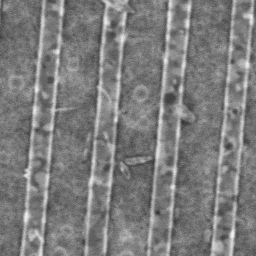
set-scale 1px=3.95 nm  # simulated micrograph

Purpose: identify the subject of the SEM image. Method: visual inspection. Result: one or a few lines or trenches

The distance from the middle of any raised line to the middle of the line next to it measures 63.1 pixels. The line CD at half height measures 76.1 nanometres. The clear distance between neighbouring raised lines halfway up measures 0.172 µm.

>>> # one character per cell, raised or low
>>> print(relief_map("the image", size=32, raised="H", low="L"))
LLLLLHHHLLLLLHHHLLLLLHHHLLLLLHHH
LLLLLHHHLLLLLHHHLLLLLHHHLLLLLHHL
LLLLLHHHLLLLLHHHLLLLLHHHLLLLLHHL
LLLLLHHHLLLLLHHLLLLLLHHHLLLLLHHL
LLLLLHHHLLLLLHHLLLLLLHHLLLLLLHHL
LLLLLHHLLLLLLHHLLLLLLHHLLLLLLHHL
LLLLLHHLLLLLLHHLLLLLLHHLLLLLLHHL
LLLLLHHLLLLLLHHLLLLLLHHLLLLLLHHL
LLLLLHHLLLLLLHHLLLLLLHHLLLLLLHHL
LLLLLHHLLLLLLHHLLLLLLHHLLLLLLHHL
LLLLLHHLLLLLHHHLLLLLHHHLLLLLHHHL
LLLLLHHLLLLLHHHLLLLLHHHLLLLLHHHL
LLLLHHHLLLLLHHHLLLLLHHHLLLLLHHHL
LLLLHHHLLLLLHHHLLLLLHHHLLLLLHHLL
LLLLHHHLLLLLHHHLLLLLHHHHLLLLHHLL
LLLLHHHLLLLLHHLLLLLLHHLLLLLLHHLL
LLLLHHLLLLLLHHLLLLLLHHLLLLLLHHLL
LLLLHHLLLLLLHHLLLLLLHHLLLLLLHHLL
LLLLHHLLLLLLHHLLLLLLHHLLLLLLHHLL
LLLLHHLLLLLLHHLLLLLLHHLLLLLLHHLL
LLLLHHLLLLLLHHLLLLLLHHLLLLLHHHLL
LLLHHHLLLLLLHHLLLLLHHHLLLLLHHHLL
LLLHHHLLLLLHHHLLLLLHHHLLLLLHHHLL
LLLHHHLLLLLHHHLLLLLHHHLLLLLHHHLL
LLLHHHLLLLLHHHLLLLLHHHLLLLLHHHLL
LLLHHHLLLLLHHLLLLLLHHHLLLLLHHLLL
LLLHHHLLLLLHHLLLLLLHHLLLLLLHHLLL
LLLHHHLLLLLHHLLLLLLHHLLLLLLHHLLL
LLLHHLLLLLLHHLLLLLLHHLLLLLLHHLLL
LLLHHLLLLLLHHLLLLLLHHLLLLLLHHLLL
LLLHHLLLLLLHHLLLLLLHHLLLLLLHHLLL
LLLHHLLLLLLHHLLLLLLHHLLLLLLHHLLL